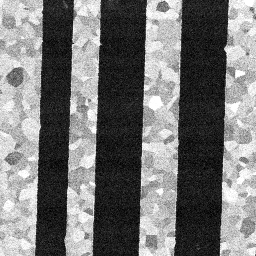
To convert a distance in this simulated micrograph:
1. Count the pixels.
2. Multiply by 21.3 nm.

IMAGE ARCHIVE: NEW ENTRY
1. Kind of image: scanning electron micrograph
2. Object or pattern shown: one or a few lines or trenches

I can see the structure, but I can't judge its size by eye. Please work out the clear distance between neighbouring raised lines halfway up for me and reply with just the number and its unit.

982 nm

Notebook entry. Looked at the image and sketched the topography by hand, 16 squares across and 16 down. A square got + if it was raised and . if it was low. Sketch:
+++..+...++...++
+++..+...++...++
+++..+...++...++
+++..+...++...++
+++.++...++...++
+++.++...++...++
++..++...++...++
++..++...++...++
++..++...++...++
++..++...++...++
++..++...++...++
++..++...++...++
++..++...++...++
++..++...++...++
++..++...++...++
++..++...++...++